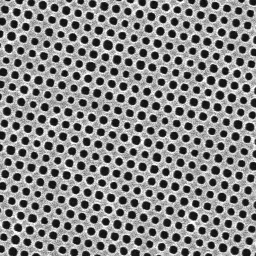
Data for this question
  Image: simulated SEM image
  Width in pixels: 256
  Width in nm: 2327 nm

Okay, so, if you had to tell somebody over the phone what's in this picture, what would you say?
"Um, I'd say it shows a regular array of holes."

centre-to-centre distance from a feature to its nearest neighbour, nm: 108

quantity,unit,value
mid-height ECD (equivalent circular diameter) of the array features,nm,74